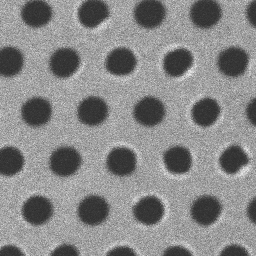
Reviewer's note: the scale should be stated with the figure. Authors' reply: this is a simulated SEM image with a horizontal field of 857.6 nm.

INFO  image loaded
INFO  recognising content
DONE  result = a regular array of holes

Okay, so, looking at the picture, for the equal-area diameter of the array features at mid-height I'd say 30.9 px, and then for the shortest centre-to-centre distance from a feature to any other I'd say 0.187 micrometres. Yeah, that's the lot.